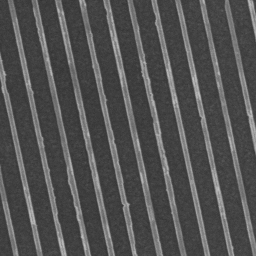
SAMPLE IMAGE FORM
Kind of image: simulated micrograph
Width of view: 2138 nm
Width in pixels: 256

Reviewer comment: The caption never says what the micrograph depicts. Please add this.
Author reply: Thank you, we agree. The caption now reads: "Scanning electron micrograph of parallel lines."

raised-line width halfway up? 0.0409 um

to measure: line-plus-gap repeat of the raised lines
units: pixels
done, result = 23.4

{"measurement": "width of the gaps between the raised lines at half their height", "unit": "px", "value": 18.6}